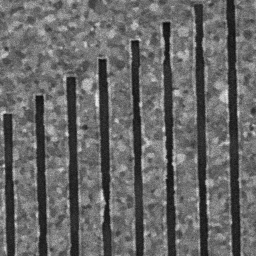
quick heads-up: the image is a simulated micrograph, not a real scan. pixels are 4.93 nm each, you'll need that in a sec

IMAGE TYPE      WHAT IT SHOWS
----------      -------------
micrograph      parallel lines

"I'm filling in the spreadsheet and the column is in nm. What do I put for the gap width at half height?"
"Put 40.7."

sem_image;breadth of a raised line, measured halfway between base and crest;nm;118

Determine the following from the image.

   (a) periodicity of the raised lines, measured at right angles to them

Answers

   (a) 32.2 px